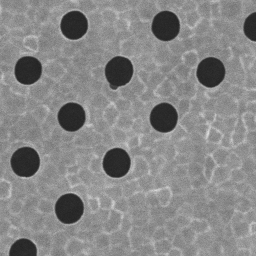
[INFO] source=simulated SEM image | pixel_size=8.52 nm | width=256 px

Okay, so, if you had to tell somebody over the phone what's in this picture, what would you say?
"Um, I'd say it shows a regular array of holes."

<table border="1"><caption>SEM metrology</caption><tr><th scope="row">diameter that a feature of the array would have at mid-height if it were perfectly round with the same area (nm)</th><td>250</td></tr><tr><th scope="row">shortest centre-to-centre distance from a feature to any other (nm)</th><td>545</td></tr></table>